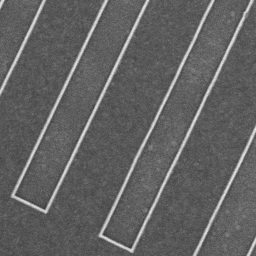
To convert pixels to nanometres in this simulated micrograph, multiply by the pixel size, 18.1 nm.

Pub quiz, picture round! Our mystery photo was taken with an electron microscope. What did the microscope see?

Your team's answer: one or a few lines or trenches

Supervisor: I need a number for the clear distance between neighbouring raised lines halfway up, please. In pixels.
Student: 36.4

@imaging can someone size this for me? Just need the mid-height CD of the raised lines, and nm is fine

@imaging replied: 1060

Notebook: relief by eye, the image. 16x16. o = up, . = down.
...ooo...oooo...
..oooo...oooo..o
..ooo...oooo...o
.oooo...oooo..oo
.ooo...oooo...oo
oooo...oooo..ooo
oooo..oooo...ooo
ooo...oooo..oooo
ooo..oooo...oooo
oo...oooo..oooo.
oo..oooo...oooo.
o...oooo..oooo..
o..oooo...oooo..
ooooooo..oooo...
oooooo...oooo...
oooooooooooo....